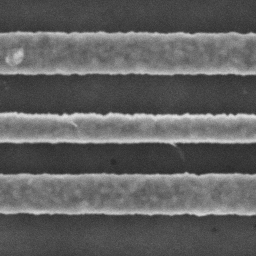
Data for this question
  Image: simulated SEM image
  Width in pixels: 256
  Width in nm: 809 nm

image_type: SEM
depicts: lines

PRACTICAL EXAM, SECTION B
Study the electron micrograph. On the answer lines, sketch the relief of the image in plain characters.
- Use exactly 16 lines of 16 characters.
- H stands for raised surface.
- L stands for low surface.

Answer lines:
LLLLLLLLLLLLLLLL
LLLLLLLLLLLLLLLL
HHHHHHHHHHHHHHHH
HHHHHHHHHHHHHHHH
HHHHHHHHHHHHHHHH
LLLLLLLLLLLLLLLL
LLLLLLLLLLLLLLLL
HHHHHHHHHHHHHHHH
HHHHHHHHHHHHHHHH
LLLLLLLLLLLLLLLL
LLLLLLLLLLLLLLLL
HHHHHHHHHHHHHHHH
HHHHHHHHHHHHHHHH
LLLLLLLLLLLLLLLL
LLLLLLLLLLLLLLLL
LLLLLLLLLLLLLLLL